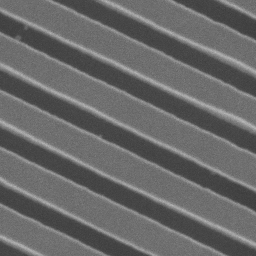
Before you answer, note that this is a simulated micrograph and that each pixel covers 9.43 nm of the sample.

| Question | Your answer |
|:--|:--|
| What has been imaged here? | lines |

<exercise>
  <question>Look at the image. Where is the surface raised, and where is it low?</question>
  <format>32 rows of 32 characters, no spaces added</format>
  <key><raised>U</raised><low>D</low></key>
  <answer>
UUUUUUUDDDDDDUUUUUUUUUDDDDDDUUUU
UUUUUUUUUUDDDDDUUUUUUUUUUDDDDDUU
DDUUUUUUUUUUDDDDDDUUUUUUUUDDDDDD
DDDDUUUUUUUUUUDDDDDUUUUUUUUUUDDD
UDDDDDDUUUUUUUUUDDDDDDUUUUUUUUUD
UUUDDDDDDUUUUUUUUUDDDDDDUUUUUUUU
UUUUUDDDDDDUUUUUUUUUDDDDDDUUUUUU
UUUUUUUDDDDDDUUUUUUUUUDDDDDDUUUU
UUUUUUUUUDDDDDDUUUUUUUUUDDDDDDUU
DDUUUUUUUUUDDDDDDUUUUUUUUUDDDDDD
DDDDUUUUUUUUUDDDDDDUUUUUUUUUDDDD
UDDDDDUUUUUUUUUUDDDDDUUUUUUUUUDD
UUUDDDDDDUUUUUUUUUDDDDDDUUUUUUUU
UUUUUDDDDDDUUUUUUUUUDDDDDDUUUUUU
UUUUUUUDDDDDDUUUUUUUUUDDDDDDUUUU
UUUUUUUUUDDDDDUUUUUUUUUUDDDDDDUU
DDUUUUUUUUUDDDDDDUUUUUUUUUDDDDDD
DDDDUUUUUUUUUDDDDDDUUUUUUUUUDDDD
DDDDDDUUUUUUUUUDDDDDDUUUUUUUUUDD
UUDDDDDDUUUUUUUUUDDDDDDUUUUUUUUU
UUUUDDDDDDUUUUUUUUUDDDDDDUUUUUUU
UUUUUUUDDDDDUUUUUUUUUDDDDDDUUUUU
UUUUUUUUUDDDDDUUUUUUUUUDDDDDDUUU
DUUUUUUUUUUDDDDDUUUUUUUUUDDDDDDU
DDDUUUUUUUUUUDDDDDUUUUUUUUUUDDDD
DDDDDDUUUUUUUUUDDDDDDUUUUUUUUUDD
UUDDDDDDUUUUUUUUUDDDDDDUUUUUUUUU
UUUUDDDDDDUUUUUUUUUDDDDDDUUUUUUU
UUUUUUDDDDDDUUUUUUUUUDDDDDDUUUUU
UUUUUUUUUDDDDDUUUUUUUUUDDDDDDUUU
DUUUUUUUUUDDDDDDUUUUUUUUUDDDDDDU
DDDDUUUUUUUUUDDDDDUUUUUUUUUDDDDD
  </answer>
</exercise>